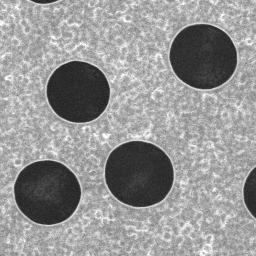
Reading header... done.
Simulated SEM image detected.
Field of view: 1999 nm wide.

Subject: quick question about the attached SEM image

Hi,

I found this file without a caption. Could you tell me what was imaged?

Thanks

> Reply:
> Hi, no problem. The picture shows holes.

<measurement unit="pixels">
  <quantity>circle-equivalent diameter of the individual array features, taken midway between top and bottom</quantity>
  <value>66.2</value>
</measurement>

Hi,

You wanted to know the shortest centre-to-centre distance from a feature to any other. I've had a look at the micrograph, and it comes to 97.9 pixels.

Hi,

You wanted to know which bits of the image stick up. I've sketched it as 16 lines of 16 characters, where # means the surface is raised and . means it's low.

################
################
###########...##
###########....#
###...#####....#
###....#####.###
###....#########
####..##########
################
#######...######
##..###....#####
#....##....####.
#....##...#####.
##..############
################
################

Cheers